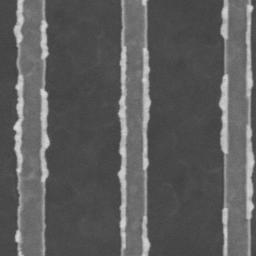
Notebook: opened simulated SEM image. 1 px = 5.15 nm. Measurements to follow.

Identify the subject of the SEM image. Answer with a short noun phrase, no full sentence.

one or a few lines or trenches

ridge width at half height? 141 nm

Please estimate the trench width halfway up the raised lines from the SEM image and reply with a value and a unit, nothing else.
392 nanometers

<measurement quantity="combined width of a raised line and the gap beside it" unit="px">103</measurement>